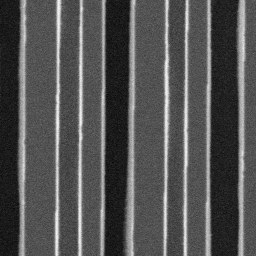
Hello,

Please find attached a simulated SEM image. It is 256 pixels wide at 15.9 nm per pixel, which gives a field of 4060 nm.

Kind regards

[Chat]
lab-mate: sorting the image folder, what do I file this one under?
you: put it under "lines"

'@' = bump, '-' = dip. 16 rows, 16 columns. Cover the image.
--@@@@--@@@@@--@
--@@@@--@@@@@--@
--@@@@--@@@@@--@
--@@@@--@@@@@--@
--@@@@--@@@@@--@
--@@@@--@@@@@--@
-@@@@@--@@@@@--@
-@@@@@--@@@@@--@
-@@@@@--@@@@@--@
-@@@@@--@@@@@--@
-@@@@@--@@@@@--@
-@@@@@--@@@@@--@
-@@@@@--@@@@@--@
-@@@@@--@@@@@--@
-@@@@@--@@@@@--@
-@@@@@--@@@@@--@